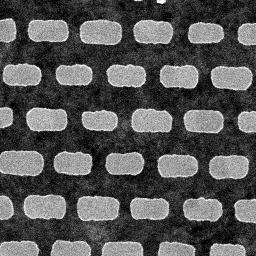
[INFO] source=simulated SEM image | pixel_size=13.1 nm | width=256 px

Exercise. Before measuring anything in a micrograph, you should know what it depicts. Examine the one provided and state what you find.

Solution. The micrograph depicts a regular array of raised bodies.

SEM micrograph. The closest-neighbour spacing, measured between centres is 661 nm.